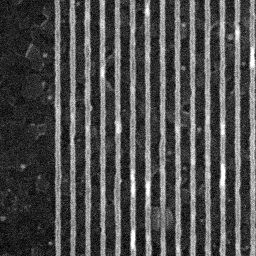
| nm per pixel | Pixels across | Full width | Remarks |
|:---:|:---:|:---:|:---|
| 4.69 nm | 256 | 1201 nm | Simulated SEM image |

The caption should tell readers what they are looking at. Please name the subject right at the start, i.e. parallel lines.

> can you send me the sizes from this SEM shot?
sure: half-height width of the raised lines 18.7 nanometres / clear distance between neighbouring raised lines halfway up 49.8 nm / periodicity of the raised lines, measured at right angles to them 0.0703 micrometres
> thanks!